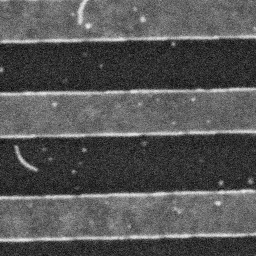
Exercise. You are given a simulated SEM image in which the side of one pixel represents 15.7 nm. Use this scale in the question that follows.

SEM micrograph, lines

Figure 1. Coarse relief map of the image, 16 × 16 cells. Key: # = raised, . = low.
################
################
########........
................
................
................
################
################
##..............
................
................
................
################
################
################
................